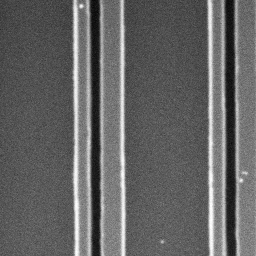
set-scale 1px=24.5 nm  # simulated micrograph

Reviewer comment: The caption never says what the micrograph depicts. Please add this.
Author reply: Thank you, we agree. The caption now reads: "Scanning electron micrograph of lines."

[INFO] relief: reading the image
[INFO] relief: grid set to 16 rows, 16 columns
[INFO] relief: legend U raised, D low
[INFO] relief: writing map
DDDDDUUUDDDDDUUU
DDDDDUUUDDDDDUUU
DDDDDUUUDDDDDUUU
DDDDDUUUDDDDDUUU
DDDDDUUUDDDDDUUU
DDDDDUUUDDDDDUUU
DDDDDUUUDDDDDUUU
DDDDDUUUDDDDDUUU
DDDDDUUUDDDDDUUU
DDDDDUUUDDDDDUUU
DDDDDUUUDDDDDUUU
DDDDDUUUDDDDDUUU
DDDDDUUUDDDDDUUU
DDDDDUUUDDDDDUUU
DDDDDUUUDDDDDUUU
DDDDDUUUDDDDDUUU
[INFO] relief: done